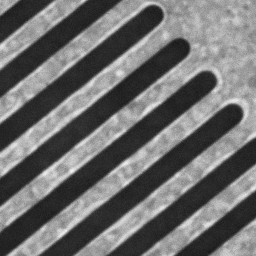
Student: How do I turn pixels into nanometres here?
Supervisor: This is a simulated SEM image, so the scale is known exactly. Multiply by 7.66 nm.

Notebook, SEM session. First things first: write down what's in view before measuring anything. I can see groups of lines, slits or small figures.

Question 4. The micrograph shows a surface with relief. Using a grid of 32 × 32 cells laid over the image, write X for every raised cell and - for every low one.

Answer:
XX-----XXX-----XXX--XXXXXXXXXXXX
-----XXXX-----XXX----XXXXXXXXXXX
----XXX-----XXXX----XXXXXXXXXXXX
---XXX-----XXX------XXXXXXXXXXXX
--XXX-----XXX------XXXXXXXXXXXXX
-XXX-----XXX------XXX---XXXXXXXX
XX-----XXXX-----XXXX----XXXXXXXX
X-----XXXX-----XXX-----XXXXXXXXX
-----XXX------XXX-----XXX-XXXXXX
----XXX-----XXXX-----XXX---XXXXX
--XXXX-----XXX-----XXXX----XXXXX
-XXXX-----XXX-----XXXX-----XXXXX
XXX-----XXXX-----XXXX----XXXXXXX
XX-----XXXX----XXXX-----XXX----X
X-----XXX-----XXXX-----XXX-----X
-----XXX-----XXXX-----XXX-----XX
----XXX-----XXX-----XXXX-----XXX
---XX------XXX-----XXXX----XXXX-
-XXX-----XXXX-----XXX-----XXXX--
XXX-----XXXX-----XXX-----XXX----
XX-----XXX------XXX-----XXX-----
X-----XXX-----XXXX----XXXX-----X
----XXX------XXX-----XXXX-----XX
---XXX-----XXXX-----XXX-----XXXX
--XXXX----XXXX-----XXX-----XXX--
-XXX-----XXX------XXX-----XXX---
XXX-----XXX------XXX-----XXX----
X-----XXXX-----XXX------XXX-----
-----XXXX-----XXX-----XXXX-----X
-----XXX-----XXX-----XXX-----XXX
---XXX-----XXXX-----XXX-----XXXX
--XXX-----XXXX-----XXX-----XXXXX